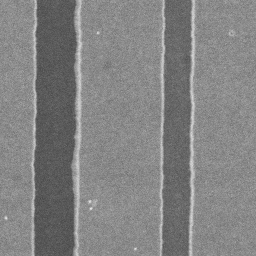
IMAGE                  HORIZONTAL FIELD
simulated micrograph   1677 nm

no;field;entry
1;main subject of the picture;lines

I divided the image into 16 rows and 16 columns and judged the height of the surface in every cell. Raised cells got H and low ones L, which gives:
HHLLLHHHHHHHHHHH
HHLLLHHHHHHHHHHH
HHLLLHHHHHHHHHHH
HHLLLHHHHHHHHHHH
HHLLLHHHHHHHHHHH
HHLLLHHHHHHHHHHH
HHLLLHHHHHHHHHHH
HHLLLHHHHHHHHHHH
HHLLLHHHHHHHHHHH
HHLLLHHHHHHHHHHH
HHLLLHHHHHHHHHHH
HHLLLHHHHHHHHHHH
HHLLLHHHHHHHHHHH
HHLLLHHHHHHHHHHH
HHLLLHHHHHHHHHHH
HHLLLHHHHHHHHHHH